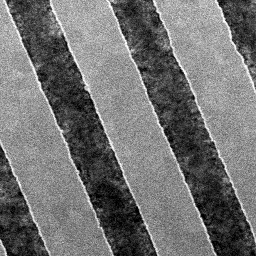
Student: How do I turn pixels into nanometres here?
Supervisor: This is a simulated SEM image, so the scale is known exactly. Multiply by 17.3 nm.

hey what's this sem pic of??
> one or a few lines or trenches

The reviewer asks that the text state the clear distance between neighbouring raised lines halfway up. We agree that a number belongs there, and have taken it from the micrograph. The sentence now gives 727 nm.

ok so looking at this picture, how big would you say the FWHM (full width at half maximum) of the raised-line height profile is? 940 nanometres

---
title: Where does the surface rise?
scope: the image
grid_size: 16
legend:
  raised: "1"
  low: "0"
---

0001111000111100
1000111000111100
1000111100011110
1100011100011110
1100011110011111
1110011110001111
1110001110001111
1110001111000111
1111000111000111
1111000111100011
0111100011100011
0111100011110001
0011110011110001
0011110001110001
0011110001111000
0001111000111000